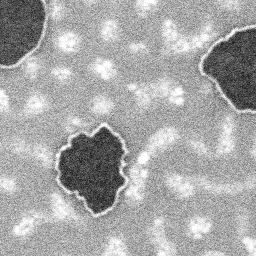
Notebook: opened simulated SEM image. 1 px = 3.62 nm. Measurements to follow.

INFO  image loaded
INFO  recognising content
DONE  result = raised bodies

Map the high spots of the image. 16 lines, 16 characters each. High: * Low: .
***.............
***.............
***...........**
**...........***
.............***
..............**
..............**
................
.....**.........
....****........
....****........
....****........
.....**.........
................
................
................